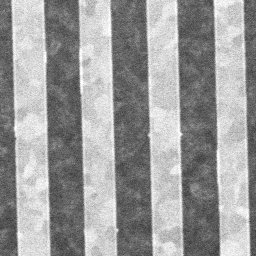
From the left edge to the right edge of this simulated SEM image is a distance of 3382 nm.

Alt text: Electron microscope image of one or a few lines or trenches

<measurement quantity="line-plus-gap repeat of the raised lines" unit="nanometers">885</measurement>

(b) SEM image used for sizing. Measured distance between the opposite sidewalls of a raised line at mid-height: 391 nanometres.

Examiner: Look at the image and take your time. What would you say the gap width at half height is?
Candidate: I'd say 505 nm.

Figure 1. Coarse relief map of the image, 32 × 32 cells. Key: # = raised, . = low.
..###.....####.....###.....###..
..###.....####.....###.....###..
..###.....####.....###.....###..
..###.....####.....###.....###..
..###.....####.....###.....###..
..###.....####.....###.....###..
..###.....####.....###.....###..
..###.....####.....###.....###..
..####....####.....###.....###..
..####....####.....###.....###..
..####....####.....###.....####.
..####....####.....###.....####.
..####....####.....###.....####.
..####....####.....###.....####.
..####....####.....###.....####.
..####....####.....###.....####.
..####....####.....###.....####.
..####.....###.....###.....####.
..####.....###.....###.....####.
..####.....###.....###.....####.
..####.....###.....###.....####.
..####.....###.....###.....####.
..####.....###.....####....####.
..####.....###.....####.#...###.
..####.....###.....####.....###.
..####.....###.....####.....###.
..####.....###.....####.....###.
..####.....###.....####.....###.
..####.....###.....####.....###.
..####.....###.....####.....###.
..####.....###.....####.....###.
..####.....###.....####.....###.